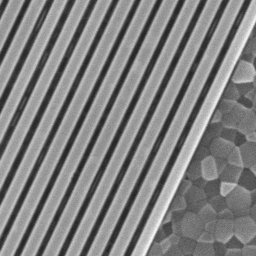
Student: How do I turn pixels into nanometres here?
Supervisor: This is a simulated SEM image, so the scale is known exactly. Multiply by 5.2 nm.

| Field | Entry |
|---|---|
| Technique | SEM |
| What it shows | parallel lines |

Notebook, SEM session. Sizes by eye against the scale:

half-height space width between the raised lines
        34.9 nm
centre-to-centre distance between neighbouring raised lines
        103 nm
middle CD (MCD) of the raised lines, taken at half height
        0.0693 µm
